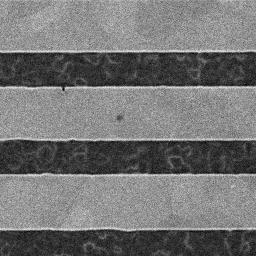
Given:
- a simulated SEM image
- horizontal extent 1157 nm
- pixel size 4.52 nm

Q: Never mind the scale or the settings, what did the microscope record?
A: one or a few lines or trenches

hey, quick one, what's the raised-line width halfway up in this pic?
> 243 nm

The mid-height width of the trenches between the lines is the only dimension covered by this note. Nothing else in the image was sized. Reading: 0.161 um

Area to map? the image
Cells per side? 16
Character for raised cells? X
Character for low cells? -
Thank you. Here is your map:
XXXXXXXXXXXXXXXX
XXXXXXXXXXXXXXXX
XXXXXXXXXXXXXXXX
----------------
----------------
XXXXXXXXXXXXXXXX
XXXXXXXXXXXXXXXX
XXXXXXXXXXXXXXXX
XXXXXXXXXXXXXXXX
----------------
----------------
XXXXXXXXXXXXXXXX
XXXXXXXXXXXXXXXX
XXXXXXXXXXXXXXXX
--------------X-
----------------